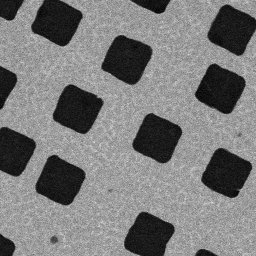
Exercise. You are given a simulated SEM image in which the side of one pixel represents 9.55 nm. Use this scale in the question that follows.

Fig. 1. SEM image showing holes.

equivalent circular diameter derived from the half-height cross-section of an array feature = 437 nm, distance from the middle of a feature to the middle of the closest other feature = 75.6 pixels